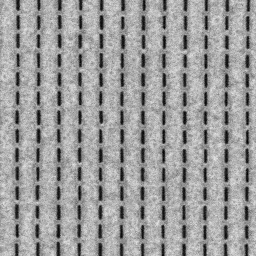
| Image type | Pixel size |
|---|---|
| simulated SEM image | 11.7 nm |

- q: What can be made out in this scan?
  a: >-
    a regular array of holes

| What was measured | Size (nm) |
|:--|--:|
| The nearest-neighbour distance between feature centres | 218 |